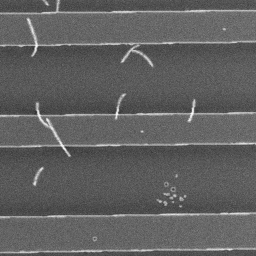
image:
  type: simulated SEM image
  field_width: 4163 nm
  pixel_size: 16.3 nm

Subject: lines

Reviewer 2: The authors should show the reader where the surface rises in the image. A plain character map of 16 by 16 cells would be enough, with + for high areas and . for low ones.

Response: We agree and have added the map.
................
++++++++++++++++
++++++++++++++++
................
................
................
................
++++++++++++++++
++++++++++++++++
................
................
................
................
.......+++++++++
++++++++++++++++
++++++++++++++++